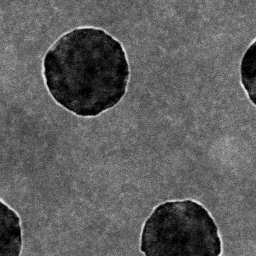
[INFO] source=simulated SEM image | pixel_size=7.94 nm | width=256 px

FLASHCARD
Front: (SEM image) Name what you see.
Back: holes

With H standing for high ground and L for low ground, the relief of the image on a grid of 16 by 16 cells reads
HHHHHHHHHHHHHHHH
HHHHHHHHHHHHHHHH
HHHHLLLHHHHHHHHH
HHHLLLLLHHHHHHHL
HHHLLLLLHHHHHHHL
HHHLLLLLHHHHHHHL
HHHHLLLHHHHHHHHH
HHHHHHHHHHHHHHHH
HHHHHHHHHHHHHHHH
HHHHHHHHHHHHHHHH
HHHHHHHHHHHHHHHH
HHHHHHHHHHHHHHHH
HHHHHHHHHHHHHHHH
LHHHHHHHHLLLLHHH
LHHHHHHHHLLLLLHH
LHHHHHHHHLLLLLHH